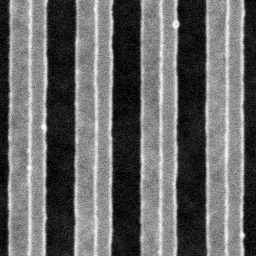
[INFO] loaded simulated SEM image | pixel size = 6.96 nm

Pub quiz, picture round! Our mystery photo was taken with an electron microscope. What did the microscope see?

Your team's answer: lines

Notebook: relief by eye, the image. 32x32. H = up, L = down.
LHHHHHLLLLHHHHLLLLHHHHLLLLHHHHLL
LHHHHHLLLLHHHHLLLLHHHHLLLLHHHHLL
LHHHHHLLLLHHHHLLLLHHHHLLLLHHHHLL
LHHHHHLLLLHHHHLLLLHHHHLLLLHHHHLL
LHHHHHLLLLHHHHLLLLHHHHLLLLHHHHLL
LHHHHHLLLLHHHHLLLLHHHHLLLLHHHHLL
LHHHHHLLLLHHHHLLLLHHHHLLLLHHHHLL
LHHHHHLLLLHHHHLLLLHHHHLLLLHHHHLL
LHHHHHLLLLHHHHLLLLHHHHLLLLHHHHLL
LHHHHHLLLLHHHHLLLLHHHHLLLLHHHHLL
LHHHHHLLLLHHHHLLLLHHHHLLLLHHHHLL
LHHHHHLLLLHHHHLLLLHHHHLLLLHHHHLL
LHHHHHLLLLHHHHLLLLHHHHLLLLHHHHLL
LHHHHHLLLLHHHHLLLLHHHHLLLLHHHHLL
LHHHHHLLLLHHHHLLLLHHHHLLLLHHHHLL
LHHHHHLLLLHHHHLLLLHHHHLLLLHHHHLL
LHHHHHLLLLHHHHLLLLHHHHLLLLHHHHLL
LHHHHHLLLLHHHHLLLLHHHHLLLLHHHHLL
LHHHHHLLLLHHHHLLLLHHHHLLLLHHHHLL
LHHHHHLLLLHHHHLLLLHHHHLLLLHHHHLL
LHHHHHLLLHHHHHLLLLHHHHLLLLHHHHLL
LHHHHHLLLLHHHHLLLLHHHHLLLLHHHHLL
LHHHHHLLLHHHHHLLLLHHHHLLLLHHHHLL
LHHHHHLLLHHHHHLLLLHHHHLLLLHHHHLL
LHHHHHLLLHHHHHLLLLHHHHLLLLHHHHLL
LHHHHHLLLHHHHHLLLLHHHHLLLLHHHHLL
LHHHHHLLLHHHHHLLLLHHHHLLLLHHHHLL
LHHHHHLLLLHHHHLLLLHHHHLLLLHHHHLL
LHHHHHLLLLHHHHLLLLHHHHLLLLHHHHLL
LHHHHHLLLLHHHHLLLLHHHHLLLLHHHHLL
LHHHHHLLLHHHHHLLLLHHHHLLLLHHHHLL
LHHHHHLLLHHHHHLLLLHHHHLLLLHHHHLL